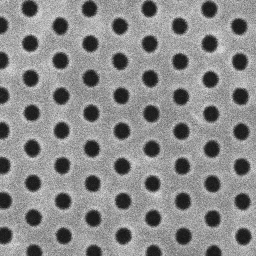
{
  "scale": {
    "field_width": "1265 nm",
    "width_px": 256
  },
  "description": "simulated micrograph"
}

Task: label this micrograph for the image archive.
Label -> a regular array of holes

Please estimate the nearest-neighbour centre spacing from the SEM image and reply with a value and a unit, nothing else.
169 nanometers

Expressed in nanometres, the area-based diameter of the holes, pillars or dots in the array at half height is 83.6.